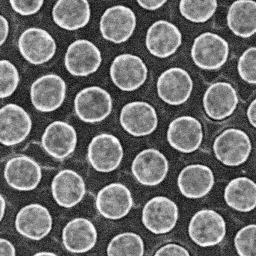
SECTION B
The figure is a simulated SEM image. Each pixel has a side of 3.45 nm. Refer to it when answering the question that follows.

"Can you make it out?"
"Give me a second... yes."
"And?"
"a regular array of raised bodies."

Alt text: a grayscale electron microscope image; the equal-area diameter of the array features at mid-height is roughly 34.1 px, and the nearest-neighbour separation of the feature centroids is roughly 164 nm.